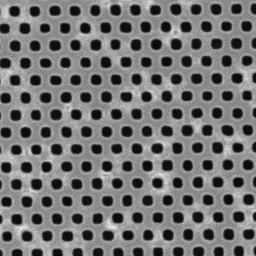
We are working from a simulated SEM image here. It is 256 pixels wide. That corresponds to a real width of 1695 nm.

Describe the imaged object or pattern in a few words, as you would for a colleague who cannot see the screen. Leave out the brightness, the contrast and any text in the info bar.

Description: a regular array of holes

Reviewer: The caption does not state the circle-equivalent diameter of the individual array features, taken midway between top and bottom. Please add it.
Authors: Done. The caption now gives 11 pixels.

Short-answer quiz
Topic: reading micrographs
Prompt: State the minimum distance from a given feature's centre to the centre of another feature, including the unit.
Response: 131 nanometres